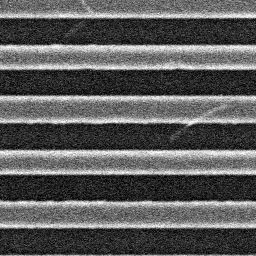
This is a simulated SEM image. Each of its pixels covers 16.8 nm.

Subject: lines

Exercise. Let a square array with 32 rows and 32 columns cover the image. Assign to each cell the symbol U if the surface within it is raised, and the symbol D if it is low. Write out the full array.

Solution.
UUUUUUUUUUUUUUUUUUUUUUUUUUUUUUUU
UUUUUUUUUUUUUUUUUUUUUUUUUUUUUUUU
DDDDDDDDDDDDDDDDDDDDDDDDDDDDDDDD
DDDDDDDDDDDDDDDDDDDDDDDDDDDDDDDD
DDDDDDDDDDDDDDDDDDDDDDDDDDDDDDDD
DDDDDDDDDDDDDDDDDDDDDDDDDDDDDDDD
UUUUUUUUUUUUUUUUUUUUUUUUUUUUUUUU
UUUUUUUUUUUUUUUUUUUUUUUUUUUUUUUU
UUUUUUUUUUDUUUUUUUUUUUUUUUUUUUUU
DDDDDDDDDDDDDDDDDDDDDDDDDDDDDDDD
DDDDDDDDDDDDDDDDDDDDDDDDDDDDDDDD
DDDDDDDDDDDDDDDDDDDDDDDDDDDDDDDD
UUUUUUUUUUUUUUUUUUUUUUUUUUUUUUUU
UUUUUUUUUUUUUUUUUUUUUUUUUUUUUUUU
UUUUUUUUUUUUUUUUUUUUUUUUUUUUUUUU
DDDDDDDDDDDDDDDDDDDDDDDDDDDDDDDD
DDDDDDDDDDDDDDDDDDDDDDDDDDDDDDDD
DDDDDDDDDDDDDDDDDDDDDDDDDDDDDDDD
DDDDDDDDDDDDDDDDDDDDDDDDDDDDDDDD
UUUUUUUUUUUUUUUUUUUUUUUUUUUUUUUU
UUUUUUUUUUUUUUUUUUUUUUUUUUUUUUUU
UUUUUUUUUUUUUUUUUUUUUUUUUUUUUUUU
DDDDDDDDDDDDDDDDDDDDDDDDDDDDDDDD
DDDDDDDDDDDDDDDDDDDDDDDDDDDDDDDD
DDDDDDDDDDDDDDDDDDDDDDDDDDDDDDDD
UUUUUUUUUUUUUUUUUUUUUUUUUUUUUUUU
UUUUUUUUUUUUUUUUUUUUUUUUUUUUUUUU
UUUUUUUUUUUUUUUUUUUUUUUUUUUUUUUU
DDDUDDDDDDDDDDDDDDDDDDDDDDDDDDDD
DDDDDDDDDDDDDDDDDDDDDDDDDDDDDDDD
DDDDDDDDDDDDDDDDDDDDDDDDDDDDDDDD
DDDDDDDDDDDDDDDDDDDDDDDDDDDDDDDD